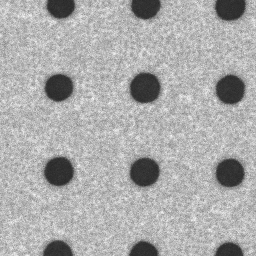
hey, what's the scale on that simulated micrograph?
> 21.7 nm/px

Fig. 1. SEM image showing holes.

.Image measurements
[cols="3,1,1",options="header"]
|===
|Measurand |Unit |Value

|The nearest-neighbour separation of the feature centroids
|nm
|1810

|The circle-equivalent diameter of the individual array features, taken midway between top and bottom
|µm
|0.642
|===